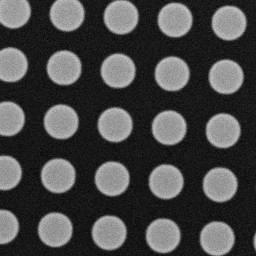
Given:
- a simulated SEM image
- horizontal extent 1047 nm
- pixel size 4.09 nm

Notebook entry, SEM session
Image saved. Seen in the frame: an array of small figures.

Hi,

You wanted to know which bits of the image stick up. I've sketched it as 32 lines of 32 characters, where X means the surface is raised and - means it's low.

XXXX---XXX----XX-----XX---------
XXXX--XXXX---XXXX---XXXX---XXX--
XXX---XXXX---XXXX---XXXX---XXXX-
-X-----XXX----XXX---XXXX---XXXX-
---------------------XX----XXX--
--------------------------------
XXX----XX-----------------------
XXX---XXXX---XXX----XXX-----X---
XXX---XXXX---XXXX--XXXXX--XXXX--
XXX---XXXX---XXXX--XXXXX--XXXX--
-------XX----XXX----XXX---XXXX--
---------------------------XX---
--------------------------------
XXX---XXX-----X-----------------
XXX---XXXX---XXX----XXX----XX---
XXX---XXXX--XXXX---XXXX---XXXX--
XX----XXX---XXXX---XXXX---XXXX--
-------------XX-----XXX---XXXX--
--------------------------------
--------------------------------
XX----XXX----XX-----------------
XXX--XXXX---XXXX---XXX----XXX---
XX---XXXX---XXXX---XXXX--XXXXX--
X-----XXX---XXXX---XXXX--XXXXX--
--------------------XX----XXX---
--------------------------------
X-------------------------------
XX---XXXX---XXX-----X-----------
XX---XXXX---XXXX--XXXX----XXX---
XX---XXXX---XXXX--XXXXX--XXXX---
------XX----XXX----XXX---XXXX---
--------------------X-----XX----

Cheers